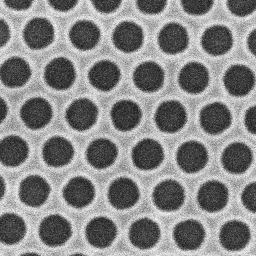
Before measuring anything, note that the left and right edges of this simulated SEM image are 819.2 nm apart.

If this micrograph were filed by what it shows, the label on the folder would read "a regular array of holes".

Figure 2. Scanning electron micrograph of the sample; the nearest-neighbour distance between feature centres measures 0.141 um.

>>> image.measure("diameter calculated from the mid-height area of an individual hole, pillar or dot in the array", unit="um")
0.11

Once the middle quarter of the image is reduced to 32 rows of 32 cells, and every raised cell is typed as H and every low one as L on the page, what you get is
LLLHHHHLLLLLLLHHHHLLLLLLHHHHHHLL
LLLHHHLLLLLLLLHHHLLLLLLLLHHHHLLL
LLLHHHLLLLLLLLHHHLLLLLLLLHHHLLLL
LLLHHHLLLLLLLLHHHLLLLLLLLHHHLLLL
LLLHHHLLLLLLLLHHHLLLLLLLLHHHLLLL
LLHHHHHLLLLLLHHHHLLLLLLLLHHHHLLL
LHHHHHHHLLLLHHHHHHLLLLLLHHHHHLLL
HHHHHHHHHHHHHHHHHHHHHHHHHHHHHHHL
HHHHLLHHHHHHHHHHHHHHHHHHHHHHHHHH
HHLLLLLLHHHHHLLLLLHHHHHHLLLLLHHH
HLLLLLLLHHHHLLLLLLLHHHHLLLLLLLHH
LLLLLLLLLHHLLLLLLLLHHHHLLLLLLLLH
LLLLLLLLLHHLLLLLLLLLHHLLLLLLLLLH
LLLLLLLLLHHHLLLLLLLHHHLLLLLLLLLH
HLLLLLLLHHHHLLLLLLLHHHLLLLLLLLLH
HLLLLLLHHHHHLLLLLLLHHHHLLLLLLLHH
HHLLLLHHHHHHHLLLLLHHHHHHLLLLLHHH
HHHHHHHHHHHHHHHHHHHHHHHHHLLHHHHH
LHHHHHHHLLLHHHHHHHHHLLHHHHHHHHHH
LLHHHHHLLLLLLHHHHHLLLLLLHHHHHHLL
LLHHHHLLLLLLLHHHHLLLLLLLLHHHHLLL
LLLHHLLLLLLLLLHHHLLLLLLLLHHHLLLL
LLLHHLLLLLLLLLHHLLLLLLLLLHHHLLLL
LLLHHLLLLLLLLHHHHLLLLLLLLHHHLLLL
LLHHHHLLLLLLLHHHHLLLLLLLLHHHLLLL
LHHHHHHLLLLLHHHHHLLLLLLLHHHHLLLL
HHHHHHHHLLHHHHHHHHHLLLLHHHHHHLLL
HHHHHHHHHHHHHHHHHHHHHHHHHHHHHHHL
HLLLLLHHHHHHHLLLLHHHHHHHHHLHHHHH
HLLLLLLHHHHLLLLLLLHHHHHHLLLLLHHH
LLLLLLLLHHHLLLLLLLLHHHHLLLLLLLHH
LLLLLLLLHHHLLLLLLLLHHHLLLLLLLLHH